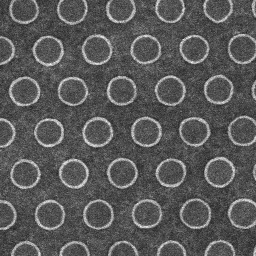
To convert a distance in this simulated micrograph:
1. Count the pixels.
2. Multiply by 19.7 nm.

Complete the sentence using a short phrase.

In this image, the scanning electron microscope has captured a regular array of raised bodies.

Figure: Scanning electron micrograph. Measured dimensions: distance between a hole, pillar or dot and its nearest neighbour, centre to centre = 47.5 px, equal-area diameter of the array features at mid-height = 558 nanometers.